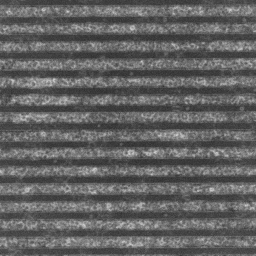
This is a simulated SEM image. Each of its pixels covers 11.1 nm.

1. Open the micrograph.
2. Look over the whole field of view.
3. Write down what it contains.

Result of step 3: parallel lines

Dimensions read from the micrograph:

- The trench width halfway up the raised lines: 118 nm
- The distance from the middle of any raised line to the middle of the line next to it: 198 nanometers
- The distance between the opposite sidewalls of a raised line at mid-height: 0.0766 um